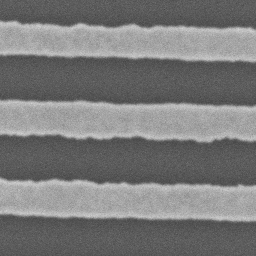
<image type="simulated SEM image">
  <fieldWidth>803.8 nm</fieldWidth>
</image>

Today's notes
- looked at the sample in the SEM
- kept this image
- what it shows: lines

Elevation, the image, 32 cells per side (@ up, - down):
--------------------------------
--------------------------------
--------------------------------
@@@@@@@@@@@@@@-@@@-@@@@@@-------
@@@@@@@@@@@@@@@@@@@@@@@@@@@@@@@@
@@@@@@@@@@@@@@@@@@@@@@@@@@@@@@@@
@@@@@@@@@@@@@@@@@@@@@@@@@@@@@@@@
-----------------------@@@@@@@@@
--------------------------------
--------------------------------
--------------------------------
--------------------------------
--------------------------------
@@@@@@@@@@@@@@@@@@@@@@@@@@@@@@@@
@@@@@@@@@@@@@@@@@@@@@@@@@@@@@@@@
@@@@@@@@@@@@@@@@@@@@@@@@@@@@@@@@
@@@@@@@@@@@@@@@@@@@@@@@@@@@@@@@@
------------------------@@@---@@
--------------------------------
--------------------------------
--------------------------------
--------------------------------
@-----@-------------------------
@@@@@@@@@@@@@@@@@@@@@@@@@@@@@@@@
@@@@@@@@@@@@@@@@@@@@@@@@@@@@@@@@
@@@@@@@@@@@@@@@@@@@@@@@@@@@@@@@@
@@@@@@@@@@@@@@@@@@@@@@@@@@@@@@@@
----------------------------@@@@
--------------------------------
--------------------------------
--------------------------------
--------------------------------